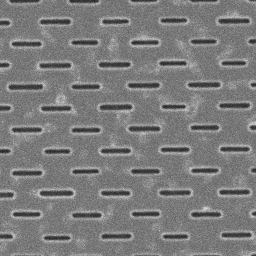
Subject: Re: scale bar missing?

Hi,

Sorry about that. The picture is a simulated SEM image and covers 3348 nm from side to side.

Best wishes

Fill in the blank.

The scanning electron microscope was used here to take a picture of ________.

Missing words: a regular array of holes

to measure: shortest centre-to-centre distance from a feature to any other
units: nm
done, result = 471